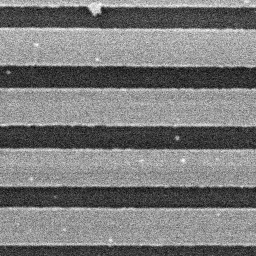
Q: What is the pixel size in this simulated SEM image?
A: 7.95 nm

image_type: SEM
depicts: lines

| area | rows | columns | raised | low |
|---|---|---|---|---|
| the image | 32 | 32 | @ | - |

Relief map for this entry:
@@@@@@@@@@@@@@@@@@@@@@@@@@@@@@@@
-----------@--------------------
--------------------------------
--------------------------------
@@@@@@@@@@@@@@@@@@@@@@@@@@@@@@@@
@@@@@@@@@@@@@@@@@@@@@@@@@@@@@@@@
@@@@@@@@@@@@@@@@@@@@@@@@@@@@@@@@
@@@@@@@@@@@@@@@@@@@@@@@@@@@@@@@@
--------------------------------
--------------------------------
--------------------------------
@@@@@@@@@@@@@@@@@@@@@@@@@@@@@@@@
@@@@@@@@@@@@@@@@@@@@@@@@@@@@@@@@
@@@@@@@@@@@@@@@@@@@@@@@@@@@@@@@@
@@@@@@@@@@@@@@@@@@@@@@@@@@@@@@@@
@@@@@@@@@@@@@@@@@@@@@@@@@@@@@@@@
--------------------------------
--------------------------------
--------------------------------
@@@@@@@@@@@@@@@@@@@@@@@@@@@@@@@@
@@@@@@@@@@@@@@@@@@@@@@@@@@@@@@@@
@@@@@@@@@@@@@@@@@@@@@@@@@@@@@@@@
@@@@@@@@@@@@@@@@@@@@@@@@@@@@@@@@
--------------------------------
--------------------------------
--------------------------------
@@@@@@@@@@@@@@@@@@@@@@@@@@@@@@@@
@@@@@@@@@@@@@@@@@@@@@@@@@@@@@@@@
@@@@@@@@@@@@@@@@@@@@@@@@@@@@@@@@
@@@@@@@@@@@@@@@@@@@@@@@@@@@@@@@@
@@@@@@@@@@@@@@@@@@@@@@@@@@@@@@@@
--------------------------------